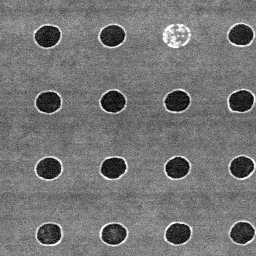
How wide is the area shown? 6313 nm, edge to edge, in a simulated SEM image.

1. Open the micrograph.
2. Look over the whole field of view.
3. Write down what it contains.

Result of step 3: a regular array of holes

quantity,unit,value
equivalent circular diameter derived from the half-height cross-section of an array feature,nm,592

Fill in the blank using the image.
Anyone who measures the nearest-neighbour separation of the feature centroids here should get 1.59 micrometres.